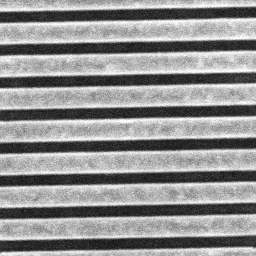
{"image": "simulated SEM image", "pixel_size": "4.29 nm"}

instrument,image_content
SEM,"parallel lines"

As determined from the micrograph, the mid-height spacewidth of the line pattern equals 54.6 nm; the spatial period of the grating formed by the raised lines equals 0.14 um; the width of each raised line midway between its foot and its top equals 20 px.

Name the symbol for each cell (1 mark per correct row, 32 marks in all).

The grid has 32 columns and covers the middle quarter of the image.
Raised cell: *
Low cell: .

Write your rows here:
********************************
********************************
**********......................
................................
................................
...............................*
********************************
********************************
********************************
********************************
*******************.............
................................
................................
................................
********************************
********************************
********************************
********************************
***************************.....
................................
................................
................................
********************************
********************************
********************************
********************************
********************************
................................
................................
................................
.......*************************
********************************